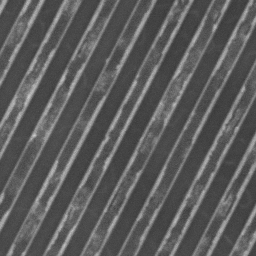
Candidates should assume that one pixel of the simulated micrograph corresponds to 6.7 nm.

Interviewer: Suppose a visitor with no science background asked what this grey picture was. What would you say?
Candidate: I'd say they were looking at parallel lines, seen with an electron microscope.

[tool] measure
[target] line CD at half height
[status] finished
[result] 0.099 micrometres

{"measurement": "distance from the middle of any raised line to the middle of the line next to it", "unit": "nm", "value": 222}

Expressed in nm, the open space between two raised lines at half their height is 124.